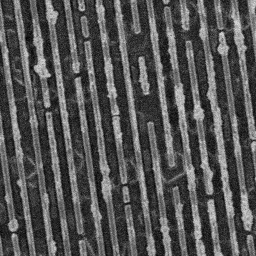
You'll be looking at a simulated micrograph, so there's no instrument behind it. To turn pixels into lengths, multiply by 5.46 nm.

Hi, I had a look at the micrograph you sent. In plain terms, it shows parallel lines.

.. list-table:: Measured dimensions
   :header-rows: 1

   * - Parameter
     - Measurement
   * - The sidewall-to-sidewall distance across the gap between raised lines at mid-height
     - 56.2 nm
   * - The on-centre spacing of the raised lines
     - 16.6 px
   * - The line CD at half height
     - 32.4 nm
